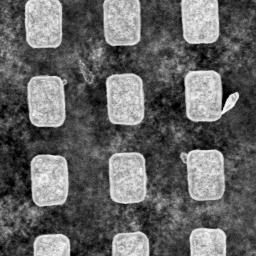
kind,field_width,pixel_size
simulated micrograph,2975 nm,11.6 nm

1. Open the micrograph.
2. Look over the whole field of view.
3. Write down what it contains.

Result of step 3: raised bodies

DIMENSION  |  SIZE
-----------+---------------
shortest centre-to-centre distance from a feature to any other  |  908 nm